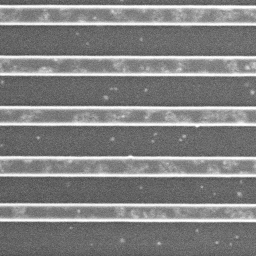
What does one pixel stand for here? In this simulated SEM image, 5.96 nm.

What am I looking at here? parallel lines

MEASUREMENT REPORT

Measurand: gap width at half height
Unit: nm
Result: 191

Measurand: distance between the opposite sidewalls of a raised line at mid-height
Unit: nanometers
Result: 107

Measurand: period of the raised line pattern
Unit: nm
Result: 294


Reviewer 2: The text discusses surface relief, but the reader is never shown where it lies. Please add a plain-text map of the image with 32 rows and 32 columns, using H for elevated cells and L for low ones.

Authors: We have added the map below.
LLLLLLLLLLLLLLLLLLLLLLLLLLLLLLLL
HHHHHHHHHHHHHHHHHHHHHHHHHHHHHHHH
HHHHHHHHHHHHHHHHHHHHHHHHHHHHHHHH
LLLLLLLLLLLLLLLLLLLLLLLLLLLLLLLL
LLLLLLLLLLLLLLLLLLLLLLLLLLLLLLLL
LLLLLLLLLLLLLLLLLLLLLLLLLLLLLLLL
LLLLLLLLLLLLLLLLLLLLLLLLLLLLLLLL
HHHHHHHHHHHHHHHHHHHHHHHHHHHHHHHH
HHHHHHHHHHHHHHHHHHHHHHHHHHHHHHHH
LLLLLLLLLLLLLLLLLLLLLLLLLLLLLLLL
LLLLLLLLLLLLLLLLLLLLLLLLLLLLLLLL
LLLLLLLLLLLLLLLLLLLLLLLLLLLLLLLL
LLLLLLLLLLLLLLLLLLLLLLLLLLLLLLLL
HHHHHHHHHHHHHHHHHHHHLLLLHHHHHHHH
HHHHHHHHHHHHHHHHHHHHHHHHHHHHHHHH
LHHHHHHHHHHHHHHHHHHHHHHHHHHHHHHH
LLLLLLLLLLLLLLLLLLLLLLLLLLLLLLLL
LLLLLLLLLLLLLLLLLLLLLLLLLLLLLLLL
LLLLLLLLLLLLLLLLLLLLLLLLLLLLLLLL
LLLLLLLLLLLLLLLLLLLLLLLLLLLLLLLL
HHHHHHHHHHHHHHHHHHHHHHHHHHHHHHHH
HHHHHHHHHHHHHHHHHHHHHHHHHHHHHHHH
LLLLLLLLLLLLLLLLLLLLLLLLLLLLLLLL
LLLLLLLLLLLLLLLLLLLLLLLLLLLLLLLL
LLLLLLLLLLLLLLLLLLLLLLLLLLLLLLLL
LLLLLLLLLLLLLLLLLLLLLLLLLLLLLLLL
HHHHHHHHHHHHHHHHHHHHHHHHHHHHHHHH
LHHHHHHHHHHHHHHHHHHHHHHHHHHHHHHH
LLLLLLLLLLLLLLLLLLLLLLLLLLLLLLLL
LLLLLLLLLLLLLLLLLLLLLLLLLLLLLLLL
LLLLLLLLLLLLLLLLLLLLLLLLLLLLLLLL
LLLLLLLLLLLLLLLLLLLLLLLLLLLLLLLL